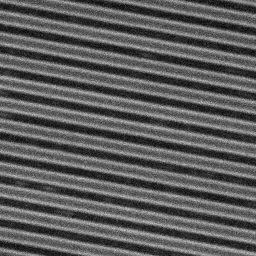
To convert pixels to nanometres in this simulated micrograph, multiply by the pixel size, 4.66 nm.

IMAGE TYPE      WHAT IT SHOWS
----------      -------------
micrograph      parallel lines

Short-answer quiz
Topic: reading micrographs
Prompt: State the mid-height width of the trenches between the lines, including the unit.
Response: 0.0464 µm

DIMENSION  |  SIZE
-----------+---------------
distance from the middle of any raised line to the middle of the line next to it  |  99.1 nm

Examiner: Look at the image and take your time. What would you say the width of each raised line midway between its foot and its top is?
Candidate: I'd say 54.4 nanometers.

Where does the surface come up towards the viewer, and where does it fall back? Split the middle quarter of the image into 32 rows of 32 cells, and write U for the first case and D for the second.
DDDDDDDDDDDDDUUUUUUUUUUUUUUUUDDD
UUUUUDDDDDDDDDDDDDDUUUUUUUUUUUUU
UUUUUUUUUUDDDDDDDDDDDDDDUUUUUUUU
UUUUUUUUUUUUUUUDDDDDDDDDDDDDDDUU
DDDDDDUUUUUUUUUUUUUUUDDDDDDDDDDD
DDDDDDDDDDDUUUUUUUUUUUUUUUDDDDDD
UUUDDDDDDDDDDDDDUUUUUUUUUUUUUUUD
UUUUUUUUDDDDDDDDDDDDDUUUUUUUUUUU
UUUUUUUUUUUUUUDDDDDDDDDDDDDUUUUU
DDDDUUUUUUUUUUUUUUUDDDDDDDDDDDDD
DDDDDDDDDUUUUUUUUUUUUUUUDDDDDDDD
DDDDDDDDDDDDDDUUUUUUUUUUUUUUUUDD
UUUUUUDDDDDDDDDDDDDDUUUUUUUUUUUU
UUUUUUUUUUUDDDDDDDDDDDDDDUUUUUUU
DUUUUUUUUUUUUUUUDDDDDDDDDDDDDDDU
DDDDDDUUUUUUUUUUUUUUUUDDDDDDDDDD
DDDDDDDDDDDDUUUUUUUUUUUUUUUDDDDD
UUUUDDDDDDDDDDDDDUUUUUUUUUUUUUUU
UUUUUUUUUDDDDDDDDDDDDDUUUUUUUUUU
UUUUUUUUUUUUUUUDDDDDDDDDDDDDUUUU
DDDDDUUUUUUUUUUUUUUUDDDDDDDDDDDD
DDDDDDDDDDUUUUUUUUUUUUUUUDDDDDDD
UDDDDDDDDDDDDDDUUUUUUUUUUUUUUUUD
UUUUUUUDDDDDDDDDDDDDDUUUUUUUUUUU
UUUUUUUUUUUUDDDDDDDDDDDDDDUUUUUU
DDUUUUUUUUUUUUUUUDDDDDDDDDDDDDDD
DDDDDDDUUUUUUUUUUUUUUUUDDDDDDDDD
DDDDDDDDDDDDDUUUUUUUUUUUUUUUDDDD
UUUUUDDDDDDDDDDDDDUUUUUUUUUUUUUU
UUUUUUUUUDDDDDDDDDDDDDDUUUUUUUUU
UUUUUUUUUUUUUUUDDDDDDDDDDDDDDUUU
DDDDDDUUUUUUUUUUUUUUUDDDDDDDDDDD